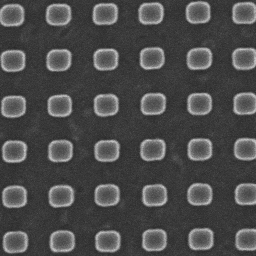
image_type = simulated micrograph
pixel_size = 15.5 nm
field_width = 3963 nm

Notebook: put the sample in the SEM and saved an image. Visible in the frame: a regular array of raised bodies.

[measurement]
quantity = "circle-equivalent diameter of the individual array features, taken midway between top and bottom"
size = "362 nanometres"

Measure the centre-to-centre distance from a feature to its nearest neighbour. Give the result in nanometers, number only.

701